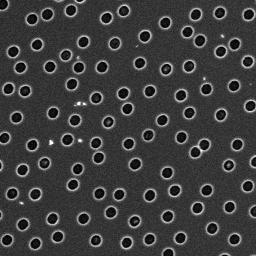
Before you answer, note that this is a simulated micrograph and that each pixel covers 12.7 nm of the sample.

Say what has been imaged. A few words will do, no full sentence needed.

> a regular array of holes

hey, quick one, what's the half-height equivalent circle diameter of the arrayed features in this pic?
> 137 nm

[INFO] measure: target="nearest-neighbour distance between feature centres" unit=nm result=276